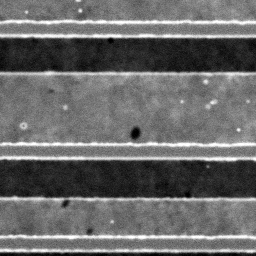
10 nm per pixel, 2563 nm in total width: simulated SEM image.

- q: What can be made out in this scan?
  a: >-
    lines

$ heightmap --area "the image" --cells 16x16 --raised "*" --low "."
****************
****************
................
................
................
****************
****************
****************
****************
****************
................
................
****************
****************
****************
****************